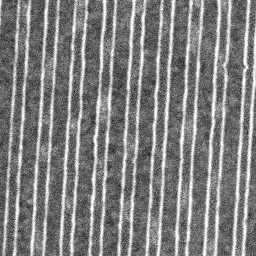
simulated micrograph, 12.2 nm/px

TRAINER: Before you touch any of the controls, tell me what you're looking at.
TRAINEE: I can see parallel lines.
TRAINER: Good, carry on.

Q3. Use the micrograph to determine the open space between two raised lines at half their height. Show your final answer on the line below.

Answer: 129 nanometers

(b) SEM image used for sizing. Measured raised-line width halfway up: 17.5 pixels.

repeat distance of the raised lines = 0.349 micrometres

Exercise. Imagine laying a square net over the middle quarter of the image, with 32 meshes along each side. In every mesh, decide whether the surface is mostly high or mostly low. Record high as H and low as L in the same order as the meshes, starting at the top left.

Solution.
HHLLLHHHHLLLHHHHLLLHHHHLLLHHHHHL
HHLLLHHHHLLLHHHHLLLHHHHLLLHHHHHL
HHLLLHHHHLLLHHHHLLLHHHHLLLHHHHLL
HHLLLHHHHLLLHHHHLLLHHHHLLLHHHHLL
HHLLHHHHHLLLHHHHLLLHHHHLLLHHHHHL
HHLLHHHHHLLLHHHHLLLHHHHLLLHHHHHL
HLLLHHHHHLLLHHHHLLLHHHHLLLHHHHLL
HLLLHHHHHLLLHHHHLLLHHHHLLLHHHHLL
HLLLHHHHHLLHHHHHLLLHHHHLLLHHHHLL
HLLLHHHHHLLHHHHHLLLHHHHLLLHHHHLL
HLLLHHHHLLLHHHHHLLLHHHHLLLHHHHLL
HLLLHHHHLLLHHHHHLLLHHHHLLLHHHHLL
HLLLHHHHLLLHHHHHLLHHHHHLLLHHHHLL
HLLLHHHHLLLHHHHHLLHHHHHLLLHHHHLL
HLLLHHHHLLLHHHHHLLHHHHHLLLHHHHLL
HLLLHHHHLLLHHHHHLLHHHHLLLLHHHHLL
HLLLHHHHLLLHHHHHLLHHHHLLLLHHHHLL
HLLLHHHHLLLHHHHLLLHHHHHLLHHHHHLL
HLLLHHHHLLLHHHHLLLHHHHHLLHHHHHLL
HLLLHHHHLLLHHHHLLLHHHHLLLHHHHLLL
HLLLHHHHLLLHHHHLLLHHHHLLLHHHHLLL
HLLHHHHHLLLHHHHLLLHHHHLLLHHHHLLL
HLLHHHHHLLLHHHHLLLHHHHLLLHHHHLLL
LLLHHHHHLLLHHHHLLLHHHHLLLHHHHLLL
LLLHHHHHLLLHHHHLLLHHHHLLLHHHHLLL
LLLHHHHHLLHHHHHLLLHHHHLLLHHHHLLL
LLLHHHHHLLHHHHHLLLHHHHLLLHHHHLLL
LLLHHHHLLLHHHHHLLLHHHHLLLHHHHLLL
LLLHHHHLLLHHHHHLLLHHHHLLLHHHHLLL
LLLHHHHLLLHHHHHLLLHHHHLLLHHHHLLL
LLLHHHHHLLHHHHHLLLHHHHLLLHHHHLLL
LLLHHHHLLLHHHHHLLHHHHHLLLHHHHLLL